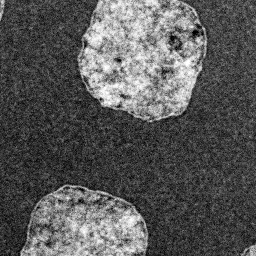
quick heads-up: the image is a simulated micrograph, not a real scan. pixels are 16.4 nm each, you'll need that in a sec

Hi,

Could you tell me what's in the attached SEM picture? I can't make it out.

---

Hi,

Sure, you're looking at holes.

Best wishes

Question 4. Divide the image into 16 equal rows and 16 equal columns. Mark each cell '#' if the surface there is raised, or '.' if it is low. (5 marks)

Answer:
######......####
######.......###
#####........###
#####........###
#####.......####
######......####
######......####
#########.######
################
################
################
################
###.....########
##.......#######
##.......#######
##.......#######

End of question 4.